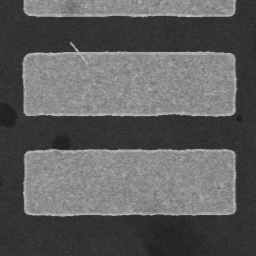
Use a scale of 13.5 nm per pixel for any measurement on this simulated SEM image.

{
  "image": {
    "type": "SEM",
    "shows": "wiring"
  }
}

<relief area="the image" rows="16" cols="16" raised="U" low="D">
DDUUUUUUUUUUUUUD
DDDDDDDDDDDDDDDD
DDDDDDDDDDDDDDDD
DDUUUUUUUUUUUUDD
DUUUUUUUUUUUUUUD
DDUUUUUUUUUUUUUD
DDUUUUUUUUUUUUUD
DDDDDDDDDDDDDDDD
DDDDDDDDDDDDDDDD
DDUUUUUUUUUUUUDD
DDUUUUUUUUUUUUUD
DDUUUUUUUUUUUUUD
DDUUUUUUUUUUUUUD
DDDDDDDDDDDDDDDD
DDDDDDDDDDDDDDDD
DDDDDDDDDDDDDDDD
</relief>